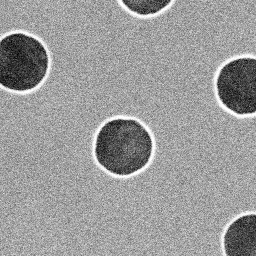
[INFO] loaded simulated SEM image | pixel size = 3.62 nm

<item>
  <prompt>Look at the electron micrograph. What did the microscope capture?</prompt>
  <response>holes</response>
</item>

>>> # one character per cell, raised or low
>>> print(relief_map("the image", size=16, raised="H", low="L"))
HHHHHHHHLLHHHHHH
HHHHHHHHHHHHHHHH
LLHHHHHHHHHHHHHH
LLLHHHHHHHHHHHHH
LLLHHHHHHHHHHHLL
LLHHHHHHHHHHHHLL
HHHHHHHHHHHHHHLL
HHHHHHHLHHHHHHHH
HHHHHHLLLHHHHHHH
HHHHHHLLLHHHHHHH
HHHHHHHLLHHHHHHH
HHHHHHHHHHHHHHHH
HHHHHHHHHHHHHHHH
HHHHHHHHHHHHHHHL
HHHHHHHHHHHHHHLL
HHHHHHHHHHHHHHLL